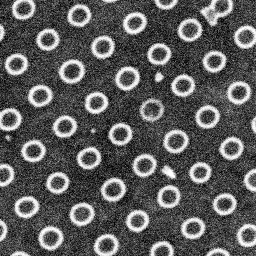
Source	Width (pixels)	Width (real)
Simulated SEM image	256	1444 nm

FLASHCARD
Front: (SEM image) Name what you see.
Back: a regular array of raised bodies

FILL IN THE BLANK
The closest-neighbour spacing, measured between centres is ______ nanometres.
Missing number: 222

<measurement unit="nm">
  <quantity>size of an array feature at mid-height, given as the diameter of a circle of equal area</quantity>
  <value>111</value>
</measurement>